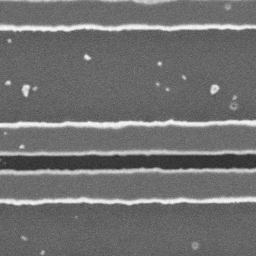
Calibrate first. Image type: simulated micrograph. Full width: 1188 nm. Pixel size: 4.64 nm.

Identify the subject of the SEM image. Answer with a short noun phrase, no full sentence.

lines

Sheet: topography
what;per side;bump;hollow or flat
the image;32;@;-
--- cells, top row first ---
@@@@@@@@@@@@@@@@@@@@@@@@@@@@@@@@
@@@@@@@@@@@@@@@@@@@@@@@@@@@@@@@@
@@@@@@@@@@@@@@@@@@@@@@@@@@@@@@@@
@@@@@@@@@@-@@@@@@-@@@@@@@@-@-@--
--------------------------------
--------------------------------
--------------------------------
--------------------------------
--------------------------------
--------------------------------
--------------------------------
--------------------------------
--------------------------------
--------------------------------
--------------------------------
@-@@@@@@@@@@@@@@@@@@@@@@@@@@@@@@
@@@@@@@@@@@@@@@@@@@@@@@@@@@@@@@@
@@@@@@@@@@@@@@@@@@@@@@@@@@@@@@@@
@@@@@@@@@@@@@@@@@@@@@@@@@@@@@@@@
--------------------------------
--------------------------------
@@@@@@@@@@@@@@@@@@@@@@@@@@@@@@@@
@@@@@@@@@@@@@@@@@@@@@@@@@@@@@@@@
@@@@@@@@@@@@@@@@@@@@@@@@@@@@@@@@
@@@@@@@@@@@@@@@@@@@@@@@@@@@@@@@@
--------------------------------
--------------------------------
--------------------------------
--------------------------------
--------------------------------
--------------------------------
--------------------------------